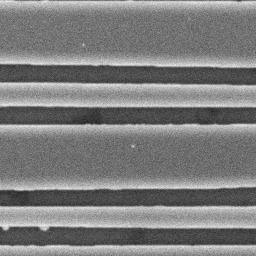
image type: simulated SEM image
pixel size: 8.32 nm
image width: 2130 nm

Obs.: lines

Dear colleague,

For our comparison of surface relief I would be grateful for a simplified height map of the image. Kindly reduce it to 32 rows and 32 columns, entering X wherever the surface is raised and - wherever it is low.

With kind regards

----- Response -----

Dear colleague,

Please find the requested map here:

XXXXXXXXXXXXXXXXXXXXXXXXXXXXXXXX
XXXXXXXXXXXXXXXXXXXXXXXXXXXXXXXX
XXXXXXXXXXXXXXXXXXXXXXXXXXXXXXXX
XXXXXXXXXXXXXXXXXXXXXXXXXXXXXXXX
XXXXXXXXXXXXXXXXXXXXXXXXXXXXXXXX
XXXXXXXXXXXXXXXXXXXXXXXXXXXXXXXX
XXXXXXXXXXXXXXXXXXXXXXXXXXXXXXXX
XXXXXXXXXXXXXXXXXXXXXXXXXXXXXXXX
--------------------------------
--------------------------------
XXXXXXX-------------------------
XXXXXXXXXXXXXXXXXXXXXXXXXXXXXXXX
XXXXXXXXXXXXXXXXXXXXXXXXXXXXXXXX
--------------------------------
--------------------------------
--------------------------------
XXXXXXXXXXXXXXXXXXXXXXXXXXXXXXXX
XXXXXXXXXXXXXXXXXXXXXXXXXXXXXXXX
XXXXXXXXXXXXXXXXXXXXXXXXXXXXXXXX
XXXXXXXXXXXXXXXXXXXXXXXXXXXXXXXX
XXXXXXXXXXXXXXXXXXXXXXXXXXXXXXXX
XXXXXXXXXXXXXXXXXXXXXXXXXXXXXXXX
XXXXXXXXXXXXXXXXXXXXXXXXXXXXXXXX
XXXXXXXXXXXXXXXXXXXXXXXXXXXX----
--------------------------------
--------------------------------
XXXXXXXXXXXXXXXXXXXXXXXXXXXXXXXX
XXXXXXXXXXXXXXXXXXXXXXXXXXXXXXXX
--------------------------------
--------------------------------
--------------------------------
XXXXXXXXXXXXXXXXXXXXXXXXXXXXXXXX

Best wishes